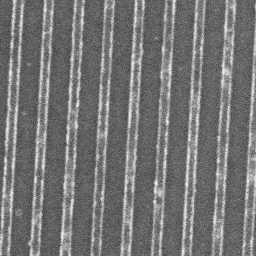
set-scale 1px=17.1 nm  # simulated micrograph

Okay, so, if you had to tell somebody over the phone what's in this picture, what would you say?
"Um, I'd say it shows parallel lines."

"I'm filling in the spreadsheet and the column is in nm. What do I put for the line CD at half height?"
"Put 143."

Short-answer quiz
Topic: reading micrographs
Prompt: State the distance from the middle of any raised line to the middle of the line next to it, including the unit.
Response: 520 nanometres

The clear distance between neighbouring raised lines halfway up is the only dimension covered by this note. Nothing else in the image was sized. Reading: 383 nanometers